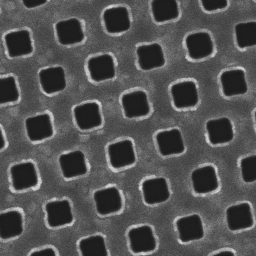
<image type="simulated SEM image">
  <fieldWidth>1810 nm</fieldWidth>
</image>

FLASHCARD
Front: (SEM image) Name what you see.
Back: a regular array of holes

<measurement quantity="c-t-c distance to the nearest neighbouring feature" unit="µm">0.351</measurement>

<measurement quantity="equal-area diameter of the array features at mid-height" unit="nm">176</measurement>